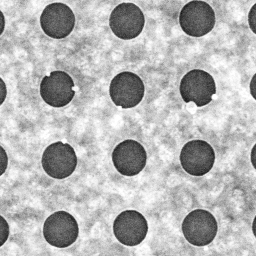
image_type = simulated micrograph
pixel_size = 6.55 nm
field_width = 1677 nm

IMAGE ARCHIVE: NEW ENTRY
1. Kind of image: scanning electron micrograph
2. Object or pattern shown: a regular array of holes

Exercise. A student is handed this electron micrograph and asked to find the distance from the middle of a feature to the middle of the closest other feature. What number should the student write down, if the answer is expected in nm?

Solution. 452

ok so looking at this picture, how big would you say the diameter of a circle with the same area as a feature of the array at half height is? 241 nm